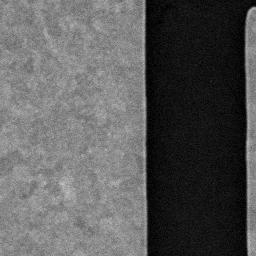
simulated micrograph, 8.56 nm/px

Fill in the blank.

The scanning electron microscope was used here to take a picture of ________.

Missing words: wiring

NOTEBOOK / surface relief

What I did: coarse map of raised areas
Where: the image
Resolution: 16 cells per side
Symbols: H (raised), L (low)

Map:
HHHHHHHHHLLLLLLL
HHHHHHHHHLLLLLLH
HHHHHHHHHLLLLLLH
HHHHHHHHHLLLLLLH
HHHHHHHHHLLLLLLH
HHHHHHHHHLLLLLLH
HHHHHHHHHLLLLLLH
HHHHHHHHHLLLLLLH
HHHHHHHHHLLLLLLH
HHHHHHHHHLLLLLLH
HHHHHHHHHLLLLLLH
HHHHHHHHHLLLLLLH
HHHHHHHHHLLLLLLH
HHHHHHHHHLLLLLLH
HHHHHHHHHLLLLLLH
HHHHHHHHHLLLLLLH